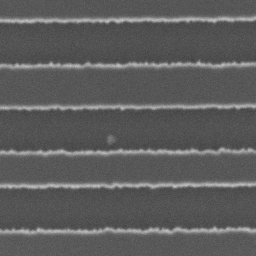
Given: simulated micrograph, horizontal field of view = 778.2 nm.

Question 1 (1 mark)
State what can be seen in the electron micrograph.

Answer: lines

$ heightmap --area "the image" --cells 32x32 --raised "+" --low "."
++++++++++++++++++++++++++++++++
++++++++++++++++++++++++++++++++
++++++++++++++++++++++++++++++++
................................
................................
................................
................................
................................
++++++++++++++++++++++++++++++++
++++++++++++++++++++++++++++++++
++++++++++++++++++++++++++++++++
++++++++++++++++++++++++++++++++
++++++++++++++++++++++++++++++++
+++++++++++++..+.+.+............
................................
................................
................................
................................
................................
++++++++++++++++++++++++++++++++
++++++++++++++++++++++++++++++++
++++++++++++++++++++++++++++++++
++++++++++++++++++++++++++++++++
................................
................................
................................
................................
................................
................................
++++++++++++++++++++++++++++++++
++++++++++++++++++++++++++++++++
++++++++++++++++++++++++++++++++